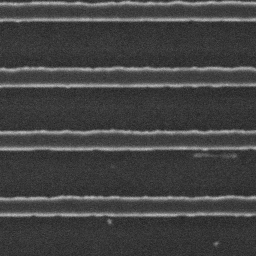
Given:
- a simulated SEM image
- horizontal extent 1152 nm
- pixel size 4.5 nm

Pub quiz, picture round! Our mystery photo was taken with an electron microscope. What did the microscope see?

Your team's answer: lines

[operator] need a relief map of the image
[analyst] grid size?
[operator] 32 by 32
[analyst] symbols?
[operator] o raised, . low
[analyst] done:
ooooooooooo.oooooooooooooooooooo
oooooooooooooooooooooooooooooooo
oooooooooooooooooooooooooooooooo
................................
................................
................................
................................
................................
...ooo........ooo.o.....oooo..oo
oooooooooooooooooooooooooooooooo
oooooooooooooooooooooooooooooooo
................................
................................
................................
................................
................................
oooooooooooooooooooooooooooooooo
oooooooooooooooooooooooooooooooo
oooooooooooooooooooooooooooooooo
................................
................................
................................
................................
................................
................................
oooooooooooooooooooooooooooooooo
oooooooooooooooooooooooooooooooo
................................
................................
................................
................................
................................